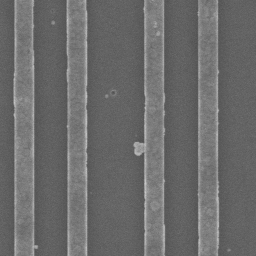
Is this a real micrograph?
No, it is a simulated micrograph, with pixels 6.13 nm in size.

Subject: lines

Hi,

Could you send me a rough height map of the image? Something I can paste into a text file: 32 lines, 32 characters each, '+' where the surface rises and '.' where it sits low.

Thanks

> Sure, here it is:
..++....+++.......++.....++.....
..++....+++.......++.....++.....
..++....+++.......++.....++.....
..++....+++.......++.....++.....
..++.....++.......++.....++.....
..++....+++.......++.....++.....
..++....+++.......++.....++.....
..++.....++.......++.....++.....
..++.....++.......++.....++.....
..++....+++.......++.....++.....
..++.....++.......++.....++.....
..++.....++.......++.....++.....
..++.....++.......+++....++.....
..++.....++.......++.....++.....
..++.....++.......++.....++.....
..++.....++.......++.....++.....
..++.....++.......+++....++.....
..++.....++.......++.....++.....
..++.....++.......++.....++.....
..++.....++.......++.....++.....
..++.....++.......++.....++.....
..++.....++.......++.....++.....
..++.....++.......++.....++.....
..++.....++.......++.....++.....
..++.....++.......++.....++.....
..++.....++.......++.....++.....
..++.....++.......++.....++.....
..++.....++.......++.....++.....
..++.....++.......+++....++.....
..++.....++.......+++....++.....
..++.....++.......+++....++.....
..++.....++.......+++....++.....